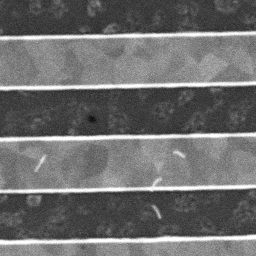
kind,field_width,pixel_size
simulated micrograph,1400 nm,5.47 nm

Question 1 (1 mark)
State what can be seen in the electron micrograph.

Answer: one or a few lines or trenches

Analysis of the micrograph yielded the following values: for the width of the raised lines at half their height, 0.278 micrometres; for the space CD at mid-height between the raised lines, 278 nanometers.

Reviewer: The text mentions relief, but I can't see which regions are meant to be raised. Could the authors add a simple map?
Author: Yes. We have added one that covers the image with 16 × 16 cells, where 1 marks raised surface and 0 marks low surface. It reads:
0000000000000000
0000000000000000
1111111111111111
1111111111111111
1111111111111111
0000000000000000
0000000000000000
0000000000000000
0000000000000111
1111111111111111
1111111111111111
1111111111111111
0000000000000000
0000000000000000
0000000000000000
1111111111111111